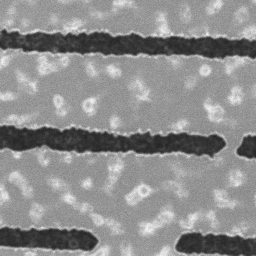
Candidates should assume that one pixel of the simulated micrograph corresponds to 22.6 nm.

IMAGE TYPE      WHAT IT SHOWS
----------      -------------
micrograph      one or a few lines or trenches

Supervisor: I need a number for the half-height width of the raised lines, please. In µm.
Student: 0.505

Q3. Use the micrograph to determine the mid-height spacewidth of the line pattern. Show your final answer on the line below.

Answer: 1.7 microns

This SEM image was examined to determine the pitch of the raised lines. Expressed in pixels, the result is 98.4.